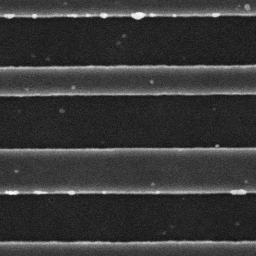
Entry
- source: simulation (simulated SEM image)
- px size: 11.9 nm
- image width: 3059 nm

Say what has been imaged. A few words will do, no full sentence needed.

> lines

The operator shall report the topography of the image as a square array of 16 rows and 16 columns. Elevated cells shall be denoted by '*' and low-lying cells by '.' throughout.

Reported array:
****************
................
................
................
****************
****************
................
................
................
****************
****************
****************
................
................
................
****************